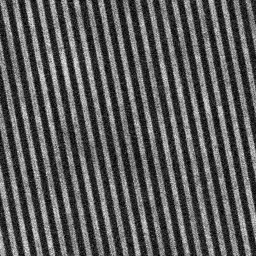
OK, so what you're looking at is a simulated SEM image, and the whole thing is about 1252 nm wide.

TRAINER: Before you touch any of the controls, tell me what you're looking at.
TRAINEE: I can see parallel lines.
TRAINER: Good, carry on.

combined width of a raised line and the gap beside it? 0.0588 micrometres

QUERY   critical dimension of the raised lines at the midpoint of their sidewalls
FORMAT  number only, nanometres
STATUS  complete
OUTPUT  21.5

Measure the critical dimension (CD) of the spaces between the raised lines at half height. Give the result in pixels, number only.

6.99